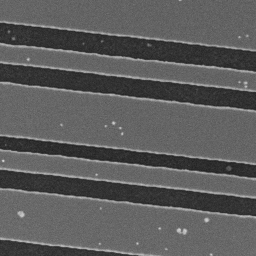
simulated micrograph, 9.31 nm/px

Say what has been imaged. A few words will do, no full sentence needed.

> lines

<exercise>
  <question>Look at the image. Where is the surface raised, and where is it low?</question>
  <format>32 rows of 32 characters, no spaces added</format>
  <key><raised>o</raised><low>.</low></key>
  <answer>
oooooooooooooooooooooooooooooooo
oooooooooooooooooooooooooooooooo
oooooooooooooooooooooooooooooooo
......oooooooooooooooooooooooooo
................oooooooooooooooo
o........................ooooooo
oooooooooo......................
oooooooooooooooooo..............
......oooooooooooooooooooooo....
..............oooooooooooooooooo
oo.....................ooooooooo
ooooooooooo.....................
oooooooooooooooooooo............
ooooooooooooooooooooooooooooo...
oooooooooooooooooooooooooooooooo
oooooooooooooooooooooooooooooooo
oooooooooooooooooooooooooooooooo
.....ooooooooooooooooooooooooooo
..............oooooooooooooooooo
oooooooo...............ooooooooo
oooooooooooooooo...............o
...oooooooooooooooooooooo.......
...........ooooooooooooooooooooo
....................oooooooooooo
oooooooo.....................ooo
oooooooooooooooooo..............
ooooooooooooooooooooooooooo.....
oooooooooooooooooooooooooooooooo
oooooooooooooooooooooooooooooooo
oooooooooooooooooooooooooooooooo
.....ooooooooooooooooooooooooooo
..............oooooooooooooooooo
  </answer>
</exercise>